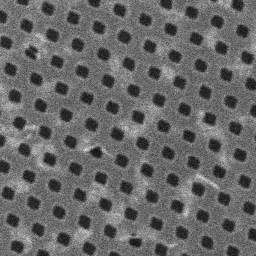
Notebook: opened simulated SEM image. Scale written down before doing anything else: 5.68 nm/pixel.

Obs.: a regular array of holes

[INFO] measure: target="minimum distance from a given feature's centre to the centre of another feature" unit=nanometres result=153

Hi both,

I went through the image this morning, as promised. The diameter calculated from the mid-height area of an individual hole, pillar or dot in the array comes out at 80.1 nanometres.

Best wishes